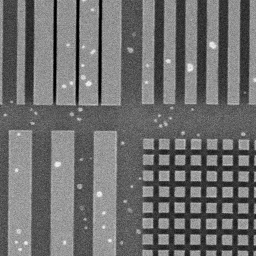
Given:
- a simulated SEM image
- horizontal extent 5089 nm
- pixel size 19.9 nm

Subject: groups of lines, slits or small figures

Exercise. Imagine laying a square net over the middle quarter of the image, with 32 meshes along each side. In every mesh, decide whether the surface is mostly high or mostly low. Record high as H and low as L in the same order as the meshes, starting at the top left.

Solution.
HHHLHHHHLLHHHHLLLLLLHHLLLHHHLLHH
HHHLHHHHLLHHHHLLLLLLHHLLLHHHLLHH
HHHLHHHHLLHHHHLLLLLLHHLLLHHHLLHH
HHHLHHHHLLHHHHLLLLLLHHLLLHHHLLHH
HHHLHHHHLLHHHHLLLLLLHHLLLHHHLLHH
HHHLHHHHLLHHHHLLLLLLHHLLLHHHLLHH
HHHLHHHHLLHHHHLLLLLLHHLLLHHHLLHH
HHHLHHHHLLHHHHLLLLLLHHLLLHHHLLHH
HHHLHHHHLLHHHHLLLLLLHHLLLHHHLLHH
HHHLHHHHLLHHHHLLLLLLHHLLLHHHLLHH
LLLLLLLLLLLLLLLLLLLLLLLLLLLLLLLL
LLLLLLLLLLLLLLLLLLLLLLLLLLLLLLLL
LLLLLLLLLLLLLLLLLLLLLLLLLLLLLLLL
LLLLLLLLLLLLLLLLLLLLLLLLLLLLLLLL
LLLLLLLLLLLLLLLLLLLLLLLLLLLLLLLL
LLLLLLLLLLLLLLLLLLLLLLLLLLLLLLLL
LLLLLLLLLLLLLLLLLLLLLLLLLLLLLLLL
HHLLLLLLHHHHHLLLLLLLLLLLLLLLLLLL
HHLLLLLLHHHHHLLLLLLLLLLLLLLLLLLL
HHLLLLLLHHHHHLLLLLLLHHLLHHLLHHLL
HHLLLLLLHHHHHLLLLLLLHHLLHHLLHHLL
HHLLLLLLHHHHHLLLLLLLLLLLLLLLLLLL
HHLLLLLLHHHHHLLLLLLLLLLLLLLLLLLL
HHLLLLLLHHHHHLLLLLLLHHLLHHLLHHLL
HHLLLLLLHHHHHLLLLLLLHHLLHHLLHHLL
HHLLLLLLHHHHHLLLLLLLLLLLLLLLLLLL
HHLLLLLLHHHHHLLLLLLLLLLLLLLLLLLL
HHLLLLLLHHHHHLLLLLLLHHLLHHLLHHLL
HHLLLLLLHHHHHLLLLLLLHHLLHHLLHHLL
HHLLLLLHHHHHHLLLLLLLLLLLLLLLLLLL
HHLLLLLHHHHHHLLLLLLLLLLLLLLLLLLL
HHLLLLLHHHHHHLLLLLLLHHLLHHLLHHLL